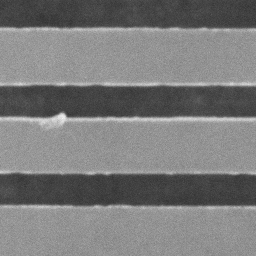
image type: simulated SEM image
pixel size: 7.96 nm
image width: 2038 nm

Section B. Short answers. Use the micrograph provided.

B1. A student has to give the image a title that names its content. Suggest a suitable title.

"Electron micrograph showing lines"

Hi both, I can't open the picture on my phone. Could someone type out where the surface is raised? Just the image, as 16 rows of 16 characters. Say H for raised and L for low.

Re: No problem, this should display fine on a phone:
LLLLLLLLLLLLLLLL
LLLLLLLLLLLLLLLL
HHHHHHHHHHHHHHHH
HHHHHHHHHHHHHHHH
HHHHHHHHHHHHHHHH
LLLLLLLLLLLLLLLL
LLLLLLLLLLLLLLLL
HHHHHHHHHHHHHHHH
HHHHHHHHHHHHHHHH
HHHHHHHHHHHHHHHH
HHHHHHHHHHHHHHHH
LLLLLLLLLLLLLLLL
LLLLLLLLLLLLLLLL
HHHHHHHHHHHHHHHH
HHHHHHHHHHHHHHHH
HHHHHHHHHHHHHHHH